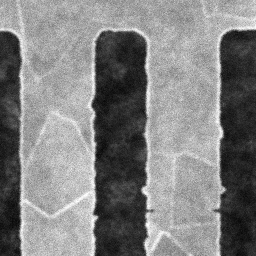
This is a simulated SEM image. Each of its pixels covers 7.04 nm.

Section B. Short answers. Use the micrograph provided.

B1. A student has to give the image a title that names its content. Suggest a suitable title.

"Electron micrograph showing one or a few lines or trenches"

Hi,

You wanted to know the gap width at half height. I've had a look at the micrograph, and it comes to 384 nanometres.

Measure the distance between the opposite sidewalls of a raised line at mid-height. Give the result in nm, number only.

502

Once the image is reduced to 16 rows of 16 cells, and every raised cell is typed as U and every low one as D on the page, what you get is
UUUUUUUUUUUUUUUU
UUUUUUUUUUUUUUUU
DUUUUUDDDUUUUUDD
DUUUUUDDDUUUUUDD
DUUUUUDDDUUUUUDD
DUUUUUDDDUUUUUDD
DUUUUUDDDUUUUUDD
DUUUUUDDDUUUUUDD
DUUUUUDDDUUUUUDD
DUUUUUDDDUUUUUDD
DUUUUUDDDUUUUUDD
DUUUUUDDDUUUUUDD
DUUUUUDDDUUUUUDD
DUUUUUDDDUUUUUDD
DUUUUUDDDUUUUUDD
DUUUUUDDDUUUUUDD